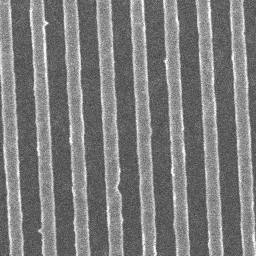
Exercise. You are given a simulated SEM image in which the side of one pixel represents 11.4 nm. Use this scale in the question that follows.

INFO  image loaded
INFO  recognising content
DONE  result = parallel lines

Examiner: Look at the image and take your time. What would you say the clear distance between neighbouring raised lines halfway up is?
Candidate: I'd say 19.9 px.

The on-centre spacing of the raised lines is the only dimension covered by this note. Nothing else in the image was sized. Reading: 379 nm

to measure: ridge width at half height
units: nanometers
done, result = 151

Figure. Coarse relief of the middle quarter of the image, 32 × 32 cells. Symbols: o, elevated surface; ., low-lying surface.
.ooo.....ooo......ooo.....ooo...
.ooo.....ooo......ooo.....ooo...
.ooo.....ooo......ooo.....ooo...
.ooo.....oooo.....ooo.....ooo...
.ooo.....oooo.....ooo.....ooo...
.ooo.....oooo.....ooo.....ooo...
.ooo.....oooo.....ooo.....ooo...
.ooo.....oooo.....ooo.....ooo...
.ooo.....oooo.....ooo.....ooo...
.oooo....oooo.....ooo.....ooo...
.ooo......ooo.....ooo.....ooo...
.ooo......ooo.....ooo.....ooo...
.ooo......ooo.....ooo.....oooo..
.oooo.....ooo.....oooo....oooo..
.oooo.....ooo.....oooo.....ooo..
..ooo.....ooo.....oooo.....ooo..
..ooo.....ooo.....oooo.....ooo..
..ooo.....ooo.....oooo.....ooo..
.oooo.....oooo....oooo.....ooo..
..ooo.....ooo......ooo.....ooo..
..ooo.....ooo......ooo.....ooo..
..ooo.....ooo.....oooo.....ooo..
..ooo.....oooo....oooo.....ooo..
..ooo.....oooo.....ooo.....ooo..
..ooo.....oooo.....ooo.....ooo..
..ooo.....oooo.....ooo.....ooo..
..ooo.....oooo.....ooo.....ooo..
..ooo.....oooo.....ooo.....ooo..
..oooo....oooo.....ooo.....oooo.
..oooo.....ooo.....ooo.....oooo.
..oooo.....oo......ooo.....ooo..
..ooo......oo......ooo.....oooo.